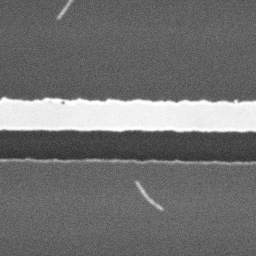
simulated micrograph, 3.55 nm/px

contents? lines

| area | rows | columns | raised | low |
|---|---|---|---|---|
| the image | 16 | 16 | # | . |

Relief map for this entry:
................
................
................
................
................
................
################
################
................
................
................
................
................
................
................
................